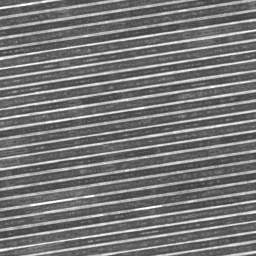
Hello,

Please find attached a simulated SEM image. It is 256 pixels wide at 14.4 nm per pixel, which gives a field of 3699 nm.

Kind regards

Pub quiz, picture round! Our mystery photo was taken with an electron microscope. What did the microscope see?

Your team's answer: parallel lines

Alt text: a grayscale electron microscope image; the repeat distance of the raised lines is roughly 144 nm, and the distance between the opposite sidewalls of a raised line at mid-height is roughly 26.7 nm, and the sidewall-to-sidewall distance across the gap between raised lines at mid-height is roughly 123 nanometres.